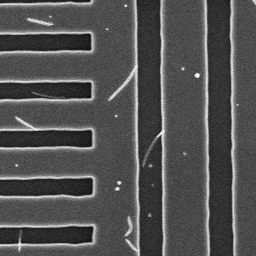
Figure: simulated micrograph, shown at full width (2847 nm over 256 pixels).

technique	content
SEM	groups of lines, slits or small figures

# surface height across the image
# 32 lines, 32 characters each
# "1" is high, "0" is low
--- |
00000111111111111000111111000111
11111111111111111000111111000111
11111111111111111000111111000111
11111111111111111000111111000111
00000000000111111000111111000111
00000000000011111000111111000111
00000001111111111000111111000111
11111111111111111000111111000111
11111111111111111000111111000111
11111111111111111000111111000111
00000000000111111000111111000111
00000000000011111000111111000111
00001100011111111000111111000111
11111111111111111000111111000111
11111111111111111000111111000111
11111111111111111000111111000111
00000000000111111000111111000111
00000000000011111000111111000111
00000001100111111000111111000111
11111111111111111000111111000111
11111111111111111000111111000111
11111111111111111000111111000111
00000000000111111000111111000111
00000000000011111000111111000111
00000000000111111000111111000111
11111111111111111000111111000111
11111111111111111000111111000111
11111111111111111000111111000111
00000000000011111000111111000111
00000000000011111000011111000111
00100000001111111000111111000111
11111111111111111000111111000111